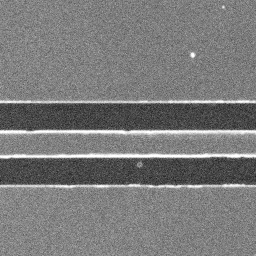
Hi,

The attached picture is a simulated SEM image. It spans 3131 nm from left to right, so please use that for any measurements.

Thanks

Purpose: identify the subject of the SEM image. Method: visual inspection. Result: lines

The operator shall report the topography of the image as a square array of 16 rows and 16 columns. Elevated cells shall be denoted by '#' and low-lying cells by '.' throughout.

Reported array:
################
################
################
################
################
################
................
................
################
################
................
................
################
################
################
################